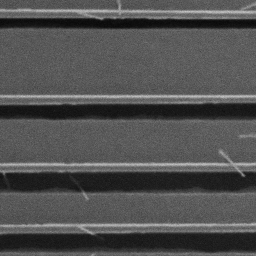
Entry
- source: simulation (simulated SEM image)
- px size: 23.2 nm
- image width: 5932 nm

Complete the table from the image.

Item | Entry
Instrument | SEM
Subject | lines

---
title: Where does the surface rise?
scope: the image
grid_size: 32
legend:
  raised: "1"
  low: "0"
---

11111111111111111111111111111111
11111111111111111111111111111111
00000000000000000000000000000000
00111100000000000000000000000000
11111111111111111111111111111111
11111111111111111111111111111111
11111111111111111111111111111111
11111111111111111111111111111111
11111111111111111111111111111111
11111111111111111111111111111111
11111111111111111111111111111111
11111111111111111111111111111111
11111111111111111111111111111111
00000000000000000000000000000000
00000000000000000000000000000000
11111111111111111111111111111111
11111111111111111111111111111111
11111111111111111111111111111111
11111111111111111111111111111111
11111111111111111111111111111111
11111111111111111111111111111111
10000000000000000000000000000010
00000000000000000000000000000000
00000000000000000000000000000000
11111111111111111111111111111111
11111111111111111111111111111111
11111111111111111111111111111111
11111111111111111111111111111111
11111111111111111111111111111111
00000000000000000000000000000000
00000000000000000000000000000000
00000000000000000000000000000000